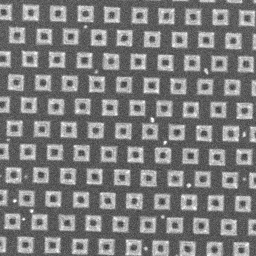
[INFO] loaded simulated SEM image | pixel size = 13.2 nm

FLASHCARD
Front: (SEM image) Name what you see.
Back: holes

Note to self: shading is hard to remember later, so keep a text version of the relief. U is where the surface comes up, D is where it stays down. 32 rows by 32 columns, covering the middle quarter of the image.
UUUUDDUUUUUDDUUUUDDDUUUUDDDUUUUD
UUUUUUUUUUUUUUUUUUUUUUUUUUUUUUUU
UUUUUUUUUUUUUUUUUUUUUUUUUUUUUUUU
DDUUUUUUUUUUUUUUUUUUUUUUUUUUUUUU
DDDUUUUDDDUUUUDDUUUUDDDUUUUDDDUU
DDDUUUUDDDUUUUDDUUUUDDDUUUUDDDUU
UUUUUUUUUUUUUUDDUUUUUDDUUUUDDDUU
UUUUUUUUUUUUUUUUUUUUUUUUUUUUUUUU
UUUUUUUUUUUUUUUUUUUUUUUUUUUUUUUU
UUUDDDUUUUUUUUUUUUUUUUUUUUUUUUUU
UUUDDDUUUUDDDUUUUDDDUUUUDDDUUUUD
UUUDDDUUUUDDDUUUUDDDUUUUDDDUUUDD
UUUUUUUUUUUUUUUUUUUUUUUUDDUUUUUD
UUUUUUUUUUUUUUUUUUUUUUUUUUUUUUUU
UUUUUUUUUUUUUUUUUUUUUUUUUUUUUUUU
DDUUUUUDDUUUUUDDUUUUUDUUUUUUUUUU
DDDUUUDDDUUUUDDDUUUUDDDUUUUDDDUU
DDUUUUDDDUUUUDDDUUUUDDDUUUUDDDUU
UUUUUUUUUUUUUUUUUUUUUUUUUUUDDUUU
UUUUUUUUUUUUUUUUUUUUUUUUUUUUUUUU
UUUUUUUUUUUUUUUUUUUUUUUUUUUUUUUU
UUUDDDUUUUDDUUUUUDDUUUUUDDUUUUUU
UUUDDDUUUUDDDUUUDDDUUUUDDDUUUUDD
UUUDDDUUUUDDDUUUDDDUUUUDDDUUUUDD
UUUUUUUUUUUUUUUUUUUUUUUUUUUUUUUU
UUUUUUUUUUUUUUUUUUUUUUUUUUUUUUUU
UUUUUUUUUUUUUUUUUUUUUUUUUUUUUUUU
DDUUUUDDDUUUUDDDUUUUDDUUUUUDDUUU
DDUUUUDDDUUUUDDDUUUUDDDUUUDDDUUU
UUUUUUUDDUUUUDDDUUUUDDUUUUDDDUUU
UUUUUUUUUUUUUUUUUUUUUUUUUUUUUUUU
UUUUUUUUUUUUUUUUUUUUUUUUUUUUUUUU